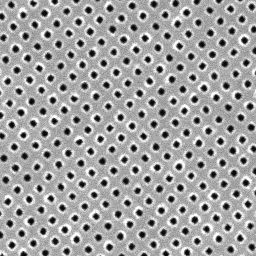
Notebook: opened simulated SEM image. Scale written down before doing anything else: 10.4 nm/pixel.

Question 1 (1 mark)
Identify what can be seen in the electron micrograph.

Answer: a regular array of holes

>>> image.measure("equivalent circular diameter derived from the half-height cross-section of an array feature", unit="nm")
78.9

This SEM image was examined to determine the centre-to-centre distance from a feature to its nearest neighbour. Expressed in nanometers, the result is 155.